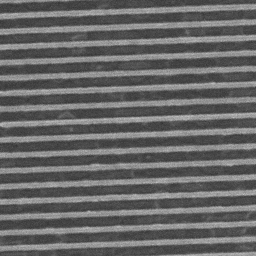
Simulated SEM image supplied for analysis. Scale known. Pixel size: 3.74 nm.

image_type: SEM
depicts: parallel lines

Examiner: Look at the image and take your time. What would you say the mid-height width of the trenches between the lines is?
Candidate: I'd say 41.1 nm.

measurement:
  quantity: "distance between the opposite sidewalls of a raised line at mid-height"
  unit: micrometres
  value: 0.0168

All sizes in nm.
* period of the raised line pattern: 57.9